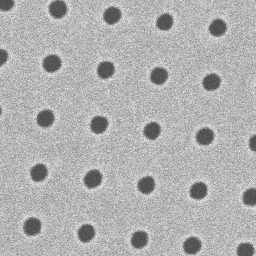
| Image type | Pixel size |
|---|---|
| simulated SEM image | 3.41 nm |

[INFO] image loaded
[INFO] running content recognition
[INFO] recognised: a regular array of holes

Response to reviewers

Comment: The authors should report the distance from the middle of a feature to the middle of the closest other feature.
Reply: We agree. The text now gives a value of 0.181 µm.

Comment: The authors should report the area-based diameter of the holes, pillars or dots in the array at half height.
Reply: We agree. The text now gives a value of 63 nanometers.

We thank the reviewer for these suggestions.